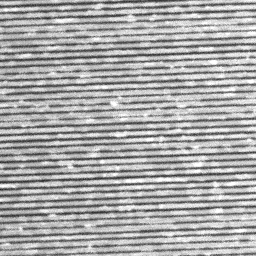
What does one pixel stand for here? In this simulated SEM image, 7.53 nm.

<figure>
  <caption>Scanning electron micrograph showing parallel lines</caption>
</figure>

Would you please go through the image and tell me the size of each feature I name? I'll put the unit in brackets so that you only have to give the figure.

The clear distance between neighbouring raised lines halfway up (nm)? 18.8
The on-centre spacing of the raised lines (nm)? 50.9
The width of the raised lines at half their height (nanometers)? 32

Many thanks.